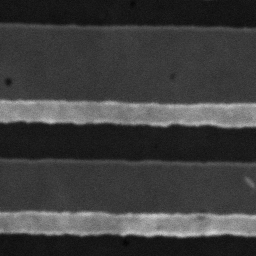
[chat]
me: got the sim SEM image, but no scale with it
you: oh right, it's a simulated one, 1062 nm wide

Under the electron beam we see lines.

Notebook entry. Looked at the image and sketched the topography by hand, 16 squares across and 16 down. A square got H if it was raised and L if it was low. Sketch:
LLLLLLLLLLLLLLLL
LLLLLLLLLLLLLLLL
HHHHHHHHHHHHHHHH
HHHHHHHHHHHHHHHH
HHHHHHHHHHHHHHHH
HHHHHHHHHHHHHHHH
HHHHHHHHHHHHHHHH
HHHHHHHHHHHHHHHH
LLLLLLLLLLLLLLLL
LLLLLLLLLLLLLLLL
HHHHHHHHHHHHHHHH
HHHHHHHHHHHHHHHH
HHHHHHHHHHHHHHHH
HHHHHHHHHHHHHHHH
HHHHHHHHHHHHHHHH
LLLLLLLLLLLLLLLL